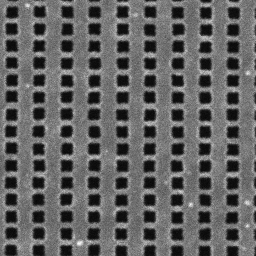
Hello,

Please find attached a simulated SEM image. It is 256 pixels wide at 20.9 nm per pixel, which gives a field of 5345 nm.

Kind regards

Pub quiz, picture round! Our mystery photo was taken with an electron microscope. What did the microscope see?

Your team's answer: a regular array of holes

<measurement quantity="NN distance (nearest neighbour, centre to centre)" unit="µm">0.352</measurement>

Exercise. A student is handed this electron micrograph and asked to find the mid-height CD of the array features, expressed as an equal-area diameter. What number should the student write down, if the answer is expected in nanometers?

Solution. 291